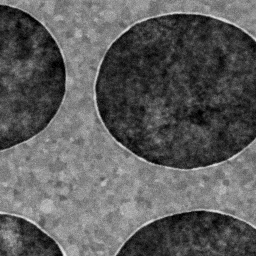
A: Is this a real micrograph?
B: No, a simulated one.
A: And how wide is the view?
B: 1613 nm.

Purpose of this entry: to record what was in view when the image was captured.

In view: holes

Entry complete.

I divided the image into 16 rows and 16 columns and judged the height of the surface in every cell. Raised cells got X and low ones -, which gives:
-XXXXXXXXXXXXXXX
---XXXXX------XX
---XXXX---------
----XXX---------
----XX----------
----XX----------
----XX----------
---XXX----------
--XXXXX---------
XXXXXXXX-------X
XXXXXXXXXXX--XXX
XXXXXXXXXXXXXXXX
XXXXXXXXXXXXXXXX
-XXXXXXXXXX---XX
---XXXXX--------
----XXXX--------